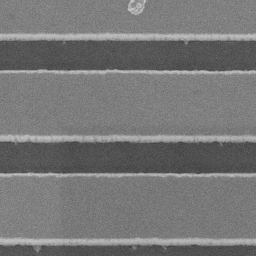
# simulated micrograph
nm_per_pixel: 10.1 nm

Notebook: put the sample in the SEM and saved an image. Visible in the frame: lines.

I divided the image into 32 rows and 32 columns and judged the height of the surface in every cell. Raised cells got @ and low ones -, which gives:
@@@@@@@@@@@@@@@@@@@@@@@@@@@@@@@@
@@@@@@@@@@@@@@@@@@@@@@@@@@@@@@@@
@@@@@@@@@@@@@@@@@@@@@@@@@@@@@@@@
@@@@@@@@@@@@@@@@@@@@@@@@@@@@@@@@
@@@@@@@@@@@@@@@@@@@@@@@@@@@@@@@@
--------------------------------
--------------------------------
--------------------------------
--------------------------------
@@@@@@@@@@@@@@@@@@@@@@@@@@@@@@@@
@@@@@@@@@@@@@@@@@@@@@@@@@@@@@@@@
@@@@@@@@@@@@@@@@@@@@@@@@@@@@@@@@
@@@@@@@@@@@@@@@@@@@@@@@@@@@@@@@@
@@@@@@@@@@@@@@@@@@@@@@@@@@@@@@@@
@@@@@@@@@@@@@@@@@@@@@@@@@@@@@@@@
@@@@@@@@@@@@@@@@@@@@@@@@@@@@@@@@
@@@@@@@@@@@@@@@@@@@@@@@@@@@@@@@@
--------------------------------
--------------------------------
--------------------------------
--------------------------------
--------------------------------
@@@@@@@@@@@@@@@@@@@@@@@@@@@@@@@@
@@@@@@@@@@@@@@@@@@@@@@@@@@@@@@@@
@@@@@@@@@@@@@@@@@@@@@@@@@@@@@@@@
@@@@@@@@@@@@@@@@@@@@@@@@@@@@@@@@
@@@@@@@@@@@@@@@@@@@@@@@@@@@@@@@@
@@@@@@@@@@@@@@@@@@@@@@@@@@@@@@@@
@@@@@@@@@@@@@@@@@@@@@@@@@@@@@@@@
@@@@@@@@@@@@@@@@@@@@@@@@@@@@@@@@
--------------------------------
--------------------------------